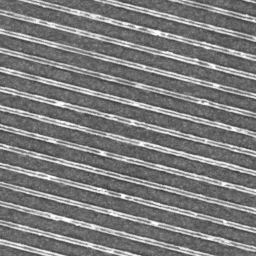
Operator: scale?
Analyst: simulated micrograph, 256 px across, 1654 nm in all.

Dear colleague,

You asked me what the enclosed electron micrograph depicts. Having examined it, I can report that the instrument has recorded parallel lines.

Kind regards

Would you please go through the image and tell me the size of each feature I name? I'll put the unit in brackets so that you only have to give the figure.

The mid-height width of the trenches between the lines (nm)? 96.2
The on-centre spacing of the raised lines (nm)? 120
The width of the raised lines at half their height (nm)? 22.7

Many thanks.